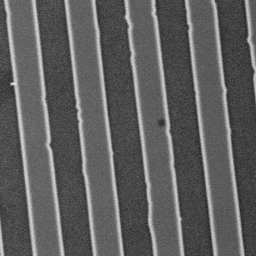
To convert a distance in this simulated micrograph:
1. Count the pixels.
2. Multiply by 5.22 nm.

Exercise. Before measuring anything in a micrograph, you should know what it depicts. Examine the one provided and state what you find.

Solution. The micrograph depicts parallel lines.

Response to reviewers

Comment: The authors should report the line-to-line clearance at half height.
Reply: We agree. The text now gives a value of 31.4 pixels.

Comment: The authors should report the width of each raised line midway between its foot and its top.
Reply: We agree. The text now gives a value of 0.143 micrometres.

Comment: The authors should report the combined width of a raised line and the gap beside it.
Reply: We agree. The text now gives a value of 312 nm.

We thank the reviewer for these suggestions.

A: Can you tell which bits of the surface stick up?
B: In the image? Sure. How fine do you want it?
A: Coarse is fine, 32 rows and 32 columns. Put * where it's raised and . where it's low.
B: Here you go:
.***....****....***....****....*
.***....****....***....****....*
.****....***....***.....***....*
.****....***....****....***....*
.****....***....****....***....*
.****....***....****....***....*
.****....***.....***....***....*
..***....****....***....****....
..***....****....***....****....
..***....****....***....****....
..***....****....***....****....
..***.....***....****....***....
..****....***....****....***....
..****....***....****....***....
..****....***....****....***....
..****....***.....***....***....
...***....****....***....****...
...***....****....***....****...
...***....****....***....****...
...***....****....****...****...
...****...****....****....***...
...****....***....****....***...
...****....***....****....***...
...****....***....****....***...
...****....****....***....***...
....***....****....***....****..
....***....****....***....****..
....***....****....***....****..
....***....****....****....***..
....****....***....****....***..
....****....***....****....***..
....****....***....****....***..